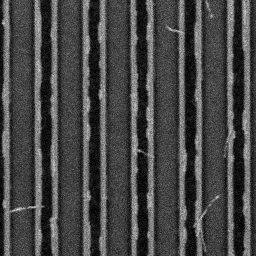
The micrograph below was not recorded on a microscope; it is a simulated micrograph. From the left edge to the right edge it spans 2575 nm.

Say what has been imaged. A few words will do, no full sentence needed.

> parallel lines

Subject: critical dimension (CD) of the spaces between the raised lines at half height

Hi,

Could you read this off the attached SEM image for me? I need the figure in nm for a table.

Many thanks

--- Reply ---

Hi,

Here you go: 306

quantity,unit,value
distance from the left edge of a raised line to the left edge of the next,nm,484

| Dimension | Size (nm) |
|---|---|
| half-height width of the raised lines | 182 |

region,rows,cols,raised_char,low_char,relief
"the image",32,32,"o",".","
o....oo....oo....oo....oo....oo.
o....oo....oo....oo....oo....oo.
o....oo....oo....oo....oo....oo.
o....oo....oo....oo....oo....oo.
o....oo....oo....oo....oo....oo.
o....oo....oo....oo....oo....oo.
o....oo....oo....oo....oo....oo.
o....oo....oo....oo....oo....oo.
o....oo....oo....oo....oo....oo.
o....oo....oo....oo....oo....oo.
o....oo....oo....oo....oo....oo.
o....oo....oo....oo....oo....oo.
o....oo....oo....oo....oo....oo.
o....oo....oo....oo....oo....oo.
o....oo....oo....oo....oo....oo.
o....oo....oo....oo....oo....oo.
o....oo....oo....oo....oo....oo.
o....oo....oo....oo....oo....oo.
o....oo....oo....oo....oo....oo.
o....oo....oo....oo....oo....oo.
o....oo....oo....oo....oo....oo.
o....oo....oo....oo....oo....oo.
o....oo....oo....oo....oo....oo.
o....oo....oo....oo....oo....oo.
o....oo....oo....oo....oo....oo.
o....oo....oo....oo....oo....oo.
o....oo....oo....oo....oo....oo.
o....oo....oo....oo....oo....oo.
o....oo....oo....oo....oo....oo.
o....oo....oo....oo....oo....oo.
o....oo....oo....oo....oo....oo.
o....oo....oo....oo....oo....oo.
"